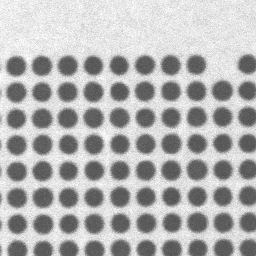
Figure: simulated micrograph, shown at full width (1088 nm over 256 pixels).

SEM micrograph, a regular array of holes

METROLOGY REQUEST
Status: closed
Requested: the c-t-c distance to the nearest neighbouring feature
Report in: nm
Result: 109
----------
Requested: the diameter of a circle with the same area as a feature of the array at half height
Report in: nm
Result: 84.4